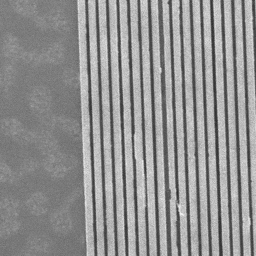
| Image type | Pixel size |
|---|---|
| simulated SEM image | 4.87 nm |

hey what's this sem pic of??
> parallel lines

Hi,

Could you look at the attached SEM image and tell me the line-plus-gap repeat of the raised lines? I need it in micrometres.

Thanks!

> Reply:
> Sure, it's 0.0509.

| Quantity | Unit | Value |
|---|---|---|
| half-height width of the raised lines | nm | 32.8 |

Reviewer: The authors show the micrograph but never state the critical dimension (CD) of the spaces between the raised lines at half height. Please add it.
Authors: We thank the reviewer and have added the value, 4.25 pixels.